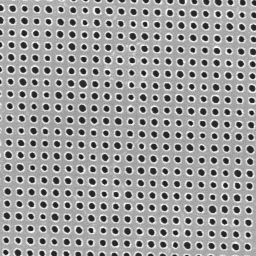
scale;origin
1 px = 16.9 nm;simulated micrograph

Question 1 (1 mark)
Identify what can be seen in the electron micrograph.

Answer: a regular array of holes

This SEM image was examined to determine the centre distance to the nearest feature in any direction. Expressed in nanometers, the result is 201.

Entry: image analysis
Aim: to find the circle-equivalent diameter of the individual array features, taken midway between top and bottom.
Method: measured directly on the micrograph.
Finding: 110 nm